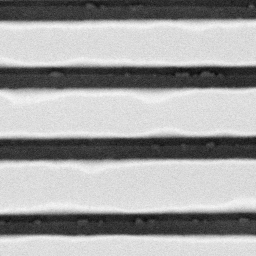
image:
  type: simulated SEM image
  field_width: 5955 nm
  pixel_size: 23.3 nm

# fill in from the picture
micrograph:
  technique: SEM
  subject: lines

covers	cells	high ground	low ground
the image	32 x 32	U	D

DDDDDDDDDDDDDDDDDDDDDDDDDDDDDDDD
DDDDDDDDDDDDDDDDDDDDDDDDDDDDDDDD
DDDDDDDDDDDDDDDDDDDDDDDDDDDDDDDD
UUUUUUUUUUUUUUUUUUUUUUUUUUUUUUUU
UUUUUUUUUUUUUUUUUUUUUUUUUUUUUUUU
UUUUUUUUUUUUUUUUUUUUUUUUUUUUUUUU
UUUUUUUUUUUUUUUUUUUUUUUUUUUUUUUU
UUUUUUUUUUUUUUUUUUUUUUUUUUUUUUUU
DDDDDDDDDDDDDDDDDDDDDDDDDDDDDDDD
DDDDDDDDDDDDDDDDDDDDDDDDDDDDDDDD
DDDDDDDDDDDDDDDDDDDDDDDDDDDDDDDD
UUUUUUUUUUUUUUUUUUUUUUUUUUUUUUUU
UUUUUUUUUUUUUUUUUUUUUUUUUUUUUUUU
UUUUUUUUUUUUUUUUUUUUUUUUUUUUUUUU
UUUUUUUUUUUUUUUUUUUUUUUUUUUUUUUU
UUUUUUUUUUUUUUUUUUUUUUUUUUUUUUUU
UUUUUUUUUUUUUUUUUUUUUUUUUUUUUUUU
DDDDDDDDDDDDDDDDDDDDDDDDDDDDDDDD
DDDDDDDDDDDDDDDDDDDDDDDDDDDDDDDD
DDDDDDDDDDDDDDDDDDDDDDDDDDDDDDDD
UUUUUUUUUUUUUUUUUUUUUUUUUUUUUUUU
UUUUUUUUUUUUUUUUUUUUUUUUUUUUUUUU
UUUUUUUUUUUUUUUUUUUUUUUUUUUUUUUU
UUUUUUUUUUUUUUUUUUUUUUUUUUUUUUUU
UUUUUUUUUUUUUUUUUUUUUUUUUUUUUUUU
UUUUUUUUUUUUUUUUUUUUUUUUUUUUUUUU
UUUUUUUUUUUUUUUUUUUUUDUDDDDDDDDD
DDDDDDDDDDDDDDDDDDDDDDDDDDDDDDDD
DDDDDDDDDDDDDDDDDDDDDDDDDDDDDDDD
DDDDDDDDDDDDDDUUDDDDDDDDDDDDDDDD
UUUUUUUUUUUUUUUUUUUUUUUUUUUUUUUU
UUUUUUUUUUUUUUUUUUUUUUUUUUUUUUUU